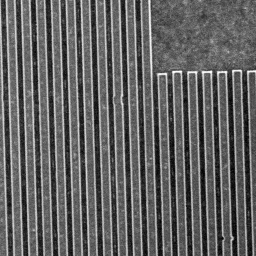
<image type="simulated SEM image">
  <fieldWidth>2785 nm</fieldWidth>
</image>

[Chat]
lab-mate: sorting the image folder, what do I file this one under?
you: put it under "parallel lines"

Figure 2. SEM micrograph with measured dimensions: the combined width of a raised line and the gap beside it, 163 nm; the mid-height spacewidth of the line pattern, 0.0652 µm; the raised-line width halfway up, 8.49 px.